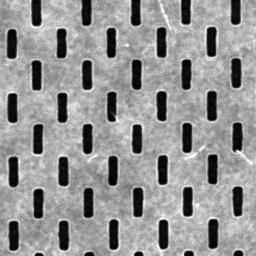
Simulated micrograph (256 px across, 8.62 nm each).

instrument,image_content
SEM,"a regular array of holes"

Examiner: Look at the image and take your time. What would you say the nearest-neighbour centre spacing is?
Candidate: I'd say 345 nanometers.